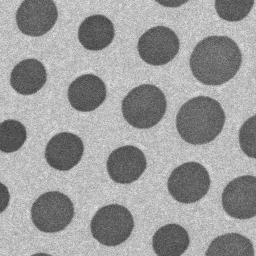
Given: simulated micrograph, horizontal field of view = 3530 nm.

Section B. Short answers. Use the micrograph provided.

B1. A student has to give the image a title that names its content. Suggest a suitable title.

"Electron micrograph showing a regular array of holes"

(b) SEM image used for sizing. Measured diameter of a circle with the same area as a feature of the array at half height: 0.578 um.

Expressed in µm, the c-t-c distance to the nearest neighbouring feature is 0.837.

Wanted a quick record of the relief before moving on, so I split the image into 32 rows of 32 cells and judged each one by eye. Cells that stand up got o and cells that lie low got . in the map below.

ooo....ooooooooooooo...oooo.....
oo.....oooooooooooooooooooo....o
oo.....ooo....oooooooooooooo..oo
oo.....ooo....ooooo..ooooooooooo
oooo.ooooo....oooo....oooo..oooo
oooooooooo....ooo.....ooo.....oo
ooooooooooooooooo.....oo......oo
ooo..ooooooooooooo...ooo......oo
oo....oooooooooooooooooo......oo
o.....oooo..oooooooooooo.....ooo
o.....ooo....ooooo.oooooo...oooo
oo...ooo.....ooo....oooooooooooo
ooooooooo....oo......ooo...ooooo
ooooooooo...ooo......o......oooo
ooooooooooooooo.....oo......ooo.
...ooooooooooooo....oo......oo..
...ooooooooooooooooooo......oo..
...ooo....ooooooooooooo....ooo..
...ooo.....oooo..ooooooooooooo..
oooooo....oooo....ooooooooooooo.
oooooo....ooo.....ooooo..ooooooo
ooooooooooooo.....ooo.....oooooo
oooooooooooooo...oooo.....ooo...
.oooooooooooooooooooo.....oo....
.oooo...ooooooooooooo.....oo....
.ooo.....ooooo.ooooooooooooo....
oooo.....ooo....oooooooooooo....
oooo.....oo......ooooooooooooooo
ooooo...ooo......ooo...ooooooooo
oooooooooooo....ooo.....ooo....o
ooooooooooooo..oooo.....oo......
ooooooooooooooooooo....ooo......